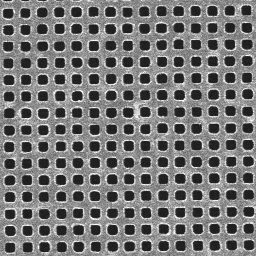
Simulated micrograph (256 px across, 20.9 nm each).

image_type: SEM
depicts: a regular array of holes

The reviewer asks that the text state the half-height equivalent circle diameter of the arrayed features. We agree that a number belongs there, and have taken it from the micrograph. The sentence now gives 11.1 pixels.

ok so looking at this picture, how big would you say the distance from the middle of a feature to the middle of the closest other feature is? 342 nanometers